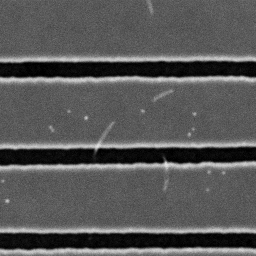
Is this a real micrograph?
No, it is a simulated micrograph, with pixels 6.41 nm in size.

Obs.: lines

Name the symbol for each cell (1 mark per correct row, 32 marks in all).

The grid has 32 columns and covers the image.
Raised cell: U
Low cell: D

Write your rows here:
UUUUUUUUUUUUUUUUUUUUUUUUUUUUUUUU
UUUUUUUUUUUUUUUUUUUUUUUUUUUUUUUU
UUUUUUUUUUUUUUUUUUUUUUUUUUUUUUUU
UUUUUUUUUUUUUUUUUUUUUUUUUUUUUUUU
UUUUUUUUUUUUUUUUUUUUUUUUUUUUUUUU
UUUUUUUUUUUUUUUUUUUUUUUUUUUUUUUU
UUUUUUUUUUUUUUUUUUUUUUUUUUUUUUUU
UUUUUUUUUUUUUUUUUUUUUUUUUUUUUUUU
DDDDDDDDDDDDDDDDDDDDDDDDDDDDDDDD
DDDDDDDDDDDDDDDDDDDDDDDDDDDDDDDD
UUUUUUUUUUUUUUUUUUUUUUUUUUUUUUUU
UUUUUUUUUUUUUUUUUUUUUUUUUUUUUUUU
UUUUUUUUUUUUUUUUUUUUUUUUUUUUUUUU
UUUUUUUUUUUUUUUUUUUUUUUUUUUUUUUU
UUUUUUUUUUUUUUUUUUUUUUUUUUUUUUUU
UUUUUUUUUUUUUUUUUUUUUUUUUUUUUUUU
UUUUUUUUUUUUUUUUUUUUUUUUUUUUUUUU
UUUUUUUUUUUUUUUUUUUUUUUUUUUUUUUU
UUUUUUUUUUUUUUUUDDDDDDDDDDDDDDDD
DDDDDDDDDDDDDDDDDDDDDDDDDDDDDDDD
DDDDDDDDDDDDDDDDDUUUUUDUUUUUUUUU
UUUUUUUUUUUUUUUUUUUUUUUUUUUUUUUU
UUUUUUUUUUUUUUUUUUUUUUUUUUUUUUUU
UUUUUUUUUUUUUUUUUUUUUUUUUUUUUUUU
UUUUUUUUUUUUUUUUUUUUUUUUUUUUUUUU
UUUUUUUUUUUUUUUUUUUUUUUUUUUUUUUU
UUUUUUUUUUUUUUUUUUUUUUUUUUUUUUUU
UUUUUUUUUUUUUUUUUUUUUUUUUUUUUUUU
UUUUUUUUUUUUUUUUUUUUUUUUUUUUUUUU
DDDDDDDDDDDDDDDDDDDDDDDDDDDDDDDD
DDDDDDDDDDDDDDDDDDDDDDDDDDDDDDDD
UUUUUUUUUUUUUUUUUUUUUUUUUUUUUUUU